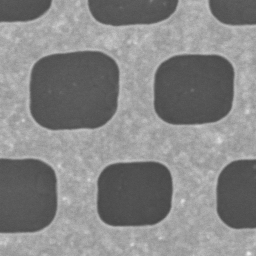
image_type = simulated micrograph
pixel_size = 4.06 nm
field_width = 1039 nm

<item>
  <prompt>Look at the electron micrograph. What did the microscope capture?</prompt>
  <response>holes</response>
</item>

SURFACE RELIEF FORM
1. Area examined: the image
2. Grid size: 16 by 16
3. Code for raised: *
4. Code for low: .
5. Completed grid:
...***.....**...
*******..*****..
****************
***....****...**
**.....***.....*
**.....***.....*
**.....***.....*
**.....***....**
****************
****************
...****...****..
....**.....***..
....**.....**...
...***....****..
..**************
****************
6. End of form